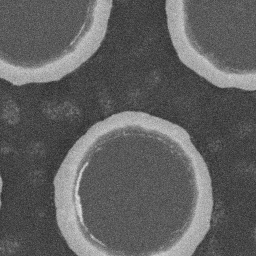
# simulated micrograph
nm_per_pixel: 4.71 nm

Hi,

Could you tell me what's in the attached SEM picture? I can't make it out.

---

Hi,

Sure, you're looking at raised bodies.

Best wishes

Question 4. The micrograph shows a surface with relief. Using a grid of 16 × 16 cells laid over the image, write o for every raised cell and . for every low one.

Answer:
oooooo.....ooooo
oooooo.....ooooo
oooooo.....ooooo
ooooo.......oooo
ooo..........ooo
................
................
.......oo.......
......ooooo.....
.....ooooooo....
....oooooooo....
....ooooooooo...
....ooooooooo...
....ooooooooo...
....oooooooo....
.....oooooo.....